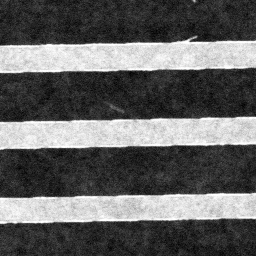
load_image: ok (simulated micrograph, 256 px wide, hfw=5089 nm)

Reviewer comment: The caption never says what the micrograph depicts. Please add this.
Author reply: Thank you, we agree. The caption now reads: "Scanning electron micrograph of lines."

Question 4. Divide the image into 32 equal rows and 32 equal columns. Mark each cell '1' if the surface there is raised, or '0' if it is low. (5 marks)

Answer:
00000000000000000000000000000000
00000000000000000000000000000000
00000000000000000000000000000000
00000000000000000000000000000000
00000000000000000000000000000000
00000000000000000011111111111111
11111111111111111111111111111111
11111111111111111111111111111111
11111111111111111111111100000000
00000000000000000000000000000000
00000000000000000000000000000000
00000000000000000000000000000000
00000000000000000000000000000000
00000000000000000000000000000000
00000000000000000000000000000000
11111111111111111111111111111111
11111111111111111111111111111111
11111111111111111111111111111111
00000000000000000000000000000000
00000000000000000000000000000000
00000000000000000000000000000000
00000000000000000000000000000000
00000000000000000000000000000000
00000000000000000000000000000000
00000000000000000000001111111111
11111111111111111111111111111111
11111111111111111111111111111111
11111111111111110000000000000000
00000000000000000000000000000000
00000000000000000000000000000000
00000000000000000000000000000000
00000000000000000000000000000000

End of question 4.